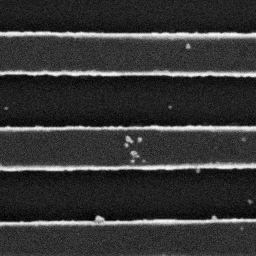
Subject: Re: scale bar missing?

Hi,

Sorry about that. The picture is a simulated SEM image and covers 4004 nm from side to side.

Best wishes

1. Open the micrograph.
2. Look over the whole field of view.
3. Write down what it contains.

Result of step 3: lines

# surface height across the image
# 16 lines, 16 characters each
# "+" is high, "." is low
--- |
................
................
++++++++++++++++
++++++++++++++++
++++++++++++++++
................
................
................
++++++++++++++++
++++++++++++++++
+++++++++.+.....
................
................
................
++++++++++++++++
++++++++++++++++